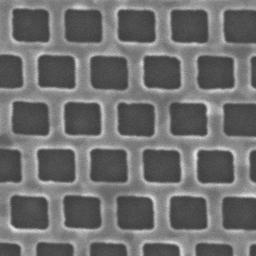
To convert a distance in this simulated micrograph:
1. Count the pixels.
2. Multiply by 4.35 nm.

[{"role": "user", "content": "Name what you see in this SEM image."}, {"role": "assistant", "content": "a regular array of holes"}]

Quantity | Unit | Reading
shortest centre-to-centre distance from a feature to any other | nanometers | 229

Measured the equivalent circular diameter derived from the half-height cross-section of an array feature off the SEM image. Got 172 nm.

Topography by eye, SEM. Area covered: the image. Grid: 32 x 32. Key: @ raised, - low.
@@@@@@@@@@@@@@@@@@@@@@@@@@@@@@@@
@@----@@----@@@----@@-----@@----
@@----@@-----@@----@@-----@@----
@@----@@-----@@----@@-----@@----
@@----@@-----@@-----@-----@@----
@@@@@@@@@@@@@@@@@@@@@@@@@@@@@---
@@@@@@@@@@@@@@@@@@@@@@@@@@@@@@@@
---@@----@@-----@@----@@@----@@-
---@@----@@-----@@-----@@----@@-
---@@----@@-----@@-----@@----@@-
---@@----@@-----@@-----@@----@@-
@@@@@@@@@@@@@@@@@@@@@@@@@@@@@@@@
@@@@@@@@@@@@@@@@@@@@@@@@@@@@@@@@
@-----@@-----@@----@@-----@@----
@-----@@-----@@----@@-----@@----
@-----@@-----@@----@@-----@@----
@@----@@-----@@----@@-----@@----
@@@@@@@@@@@@@@@@@@@@@@@@@@@@@@@@
@@@@@@@@@@@@-@@@@@@@@@@@@@@@@@@@
---@@----@@-----@@-----@@----@@-
---@@-----@-----@@-----@@----@@-
---@@-----@-----@@-----@@----@@-
---@@----@@-----@@-----@@----@@-
@@@@@@@@@@@@@@@@@@@@@@@@@@@@@@@@
@@-@@@@@---@@@@--@@@@@--@@@@@@@@
@-----@@-----@@----@@-----@@----
@-----@@-----@@----@@-----@@----
@-----@@-----@@----@@-----@@----
@@----@@@---@@@----@@@----@@----
@@@@@@@@@@@@@@@@@@@@@@@@@@@@@@@@
--@@@----@@----@@@----@@@---@@@@
---@-----@@-----@@-----@-----@@-